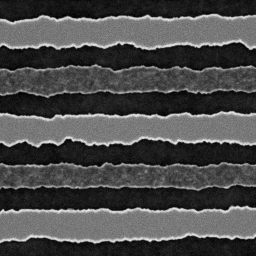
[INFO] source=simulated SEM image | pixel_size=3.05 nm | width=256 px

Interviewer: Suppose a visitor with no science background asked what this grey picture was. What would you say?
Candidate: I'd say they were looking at lines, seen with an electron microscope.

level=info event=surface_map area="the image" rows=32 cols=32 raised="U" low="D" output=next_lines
DDDDDDDDDDDDDDDDDDDDDDDDDDDDDDDD
DDDDDDDDDDDDDDDDDDDDDDDDDDDDDDDD
UDDUUUUUUUUUUUUUUUUUUUUUUUUUUUUU
UUUUUUUUUUUUUUUUUUUUUUUUUUUUUUUU
UUUUUUUUUUUUUUUUUUUUUUUUUUUUUUUU
UUUUUUUUUUUUUUUDUUUUUUUUUUUUDDUU
DDDDDDDDDDDDDDDDDDDDDDDDDDDDDDDD
DDDDDDDDDDDDDDDDDDDDDDDDDDDDDDDD
DDDUDDDUUUUUUDDDUUUUDDUDDDUDDUUU
UUUUUUUUUUUUUUUUUUUUUUUUUUUUUUUU
UUUUUUUUUUUUUUUUUUUUUUUUUUUUUUUU
UUDUUUUUUUUUDDUUUUDDUDDDUUUDDDDU
DDDDDDDDDDDDDDDDDDDDDDDDDDDDDDDD
DDDDDDDDDDDDDDDDDDDDDDDDDDDDDDDD
UUDDDDDUUUUUUUDDUUUUDUUUUUUUUUUU
UUUUUUUUUUUUUUUUUUUUUUUUUUUUUUUU
UUUUUUUUUUUUUUUUUUUUUUUUUUUUUUUU
UUUUUUUUDUUUUUUUUDDUUUUUUUUUUUUU
DDDDDDDDDDDDDDDDDDDDDDDDDDDDDDDD
DDDDDDDDDDDDDDDDDDDDDDDDDDDDDDDD
DDDDDDUUUDDDDUDUDDDDDDDDDDDUUDUD
UUUUUUUUUUUUUUUUUUUUUUUUUUUUUUUU
UUUUUUUUUUUUUUUUUUUUUUUUUUUUUUUU
DUUDUDDDDDDDDDDDDDDDDDDUUUDDDDDD
DDDDDDDDDDDDDDDDDDDDDDDDDDDDDDDD
DDDDDDDDDDDDDDDDDDDDDDDDDDDDDDDD
UUUUUUUUUUUUUUUUUUUUUUUUUUUUUUUU
UUUUUUUUUUUUUUUUUUUUUUUUUUUUUUUU
UUUUUUUUUUUUUUUUUUUUUUUUUUUUUUUU
UUUUUUUUUUUUUUUUUUUUUUUDDUUUUUUU
DDDDDDDDDDDDDDDDDDDDDDDDDDDDDDDD
DDDDDDDDDDDDDDDDDDDDDDDDDDDDDDDD